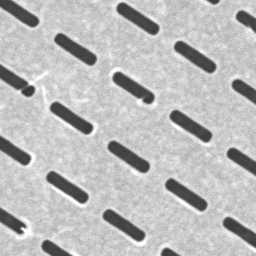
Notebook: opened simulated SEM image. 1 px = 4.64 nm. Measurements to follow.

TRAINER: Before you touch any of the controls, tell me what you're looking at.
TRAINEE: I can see a regular array of holes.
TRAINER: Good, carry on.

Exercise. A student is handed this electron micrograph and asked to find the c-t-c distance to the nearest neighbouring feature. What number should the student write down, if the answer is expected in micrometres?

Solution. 0.32